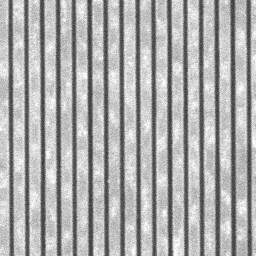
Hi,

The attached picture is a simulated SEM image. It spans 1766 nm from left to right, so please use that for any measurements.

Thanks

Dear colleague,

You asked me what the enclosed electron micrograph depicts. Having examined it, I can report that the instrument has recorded parallel lines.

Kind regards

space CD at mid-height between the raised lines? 0.0362 um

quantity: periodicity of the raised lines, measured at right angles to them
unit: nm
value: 110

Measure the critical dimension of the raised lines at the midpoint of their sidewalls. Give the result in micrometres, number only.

0.0716